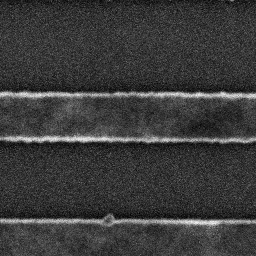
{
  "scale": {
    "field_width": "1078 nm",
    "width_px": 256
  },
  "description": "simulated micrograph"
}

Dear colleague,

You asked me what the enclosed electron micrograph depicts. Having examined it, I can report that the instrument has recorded one or a few lines or trenches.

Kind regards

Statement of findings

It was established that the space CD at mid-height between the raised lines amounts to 0.339 micrometres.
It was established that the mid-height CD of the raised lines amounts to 193 nanometres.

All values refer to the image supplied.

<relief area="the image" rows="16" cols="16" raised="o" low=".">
................
................
................
................
................
................
oooooooooooooooo
oooooooooooooooo
oooooooooooooooo
................
................
................
................
................
oooooooooooooooo
oooooooooooooooo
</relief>